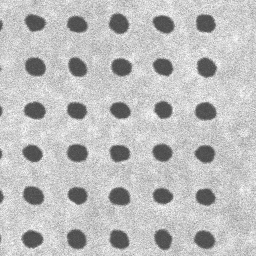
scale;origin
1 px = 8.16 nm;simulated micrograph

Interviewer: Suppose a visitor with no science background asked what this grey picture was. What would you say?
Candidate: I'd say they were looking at a regular array of holes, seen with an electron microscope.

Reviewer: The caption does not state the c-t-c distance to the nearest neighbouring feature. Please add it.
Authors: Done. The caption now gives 343 nm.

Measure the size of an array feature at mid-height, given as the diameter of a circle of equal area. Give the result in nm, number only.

157